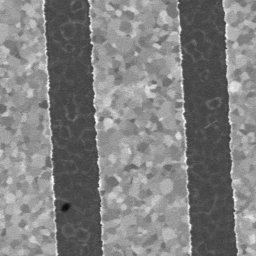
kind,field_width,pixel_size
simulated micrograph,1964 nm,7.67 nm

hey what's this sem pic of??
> one or a few lines or trenches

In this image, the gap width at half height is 0.35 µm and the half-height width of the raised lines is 88.6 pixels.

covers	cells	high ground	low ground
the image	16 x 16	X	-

XXX---XXXXX---XX
XXX---XXXXX---XX
XXX---XXXXX---XX
XXX---XXXXX---XX
XXX---XXXXX---XX
XXX---XXXXX---XX
XXX---XXXXX---XX
XXX---XXXXXX--XX
XXX---XXXXXX--XX
XXX---XXXXXX--XX
XXX---XXXXXX--XX
XXX---XXXXXX---X
XXX---XXXXXX---X
XXX---XXXXXX---X
XXX---XXXXXX---X
XXXX--XXXXXX---X